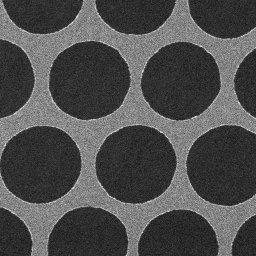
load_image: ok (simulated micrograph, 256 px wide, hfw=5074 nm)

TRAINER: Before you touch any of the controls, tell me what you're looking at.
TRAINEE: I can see holes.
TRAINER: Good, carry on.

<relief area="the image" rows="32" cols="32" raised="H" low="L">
LLLLLLLLLLHHLLLLLLLLLLHHLLLLLLLL
HLLLLLLLLLHHLLLLLLLLLLHHLLLLLLLL
HLLLLLLLLHHHHLLLLLLLLHHHLLLLLLLL
HHLLLLLLHHHHHHLLLLLLHHHHHLLLLLLL
HHHHHHHHHHHHHHHHHHHHHHHHHHLLLLHH
LLHHHHHHHLLLLHHHHHHHHLLLHHHHHHHH
LLLHHHHHLLLLLLLHHHHLLLLLLLHHHHHL
LLLLHHHLLLLLLLLLHHHLLLLLLLLHHHLL
LLLLHHLLLLLLLLLLHHLLLLLLLLLHHHLL
LLLLHHLLLLLLLLLLHHLLLLLLLLLLHLLL
LLLLHHLLLLLLLLLLHHLLLLLLLLLLHLLL
LLLLHHLLLLLLLLLLHHLLLLLLLLLHHLLL
LLLLHHHLLLLLLLLLHHLLLLLLLLLHHHLL
LLLHHHHLLLLLLLLHHHHLLLLLLLHHHHLL
LHHHHHHHHLLLLHHHHHHHLLLLLHHHHHHL
HHHHHHHHHHHHHHHHHHHHHHHHHHHHHHHH
HHLLLLLLHHHHHHLLLLLLHHHHHHLLLLLL
HLLLLLLLLHHHHLLLLLLLLHHHLLLLLLLL
LLLLLLLLLLHHLLLLLLLLLLHHLLLLLLLL
LLLLLLLLLLHHLLLLLLLLLLHLLLLLLLLL
LLLLLLLLLLHHLLLLLLLLLLHLLLLLLLLL
LLLLLLLLLLHHLLLLLLLLLLHLLLLLLLLL
LLLLLLLLLLHHLLLLLLLLLLHHLLLLLLLL
HLLLLLLLLHHHHLLLLLLLLHHHLLLLLLLL
HHLLLLLLHHHHHHLLLLLLHHHHHLLLLLLL
HHHHHHHHHHHHHHHHLHHHHHHHHHHLLLHH
LHHHHHHHLLLLLLHHHHHHHLLLHHHHHHHH
LLLHHHHLLLLLLLLHHHHLLLLLLLHHHHHL
LLLHHHHLLLLLLLLLHHLLLLLLLLLHHHLL
LLLLHHLLLLLLLLLLHHLLLLLLLLLHHLLL
LLLLHHLLLLLLLLLLHLLLLLLLLLLHHLLL
LLLLHHLLLLLLLLLLHLLLLLLLLLLHHLLL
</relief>